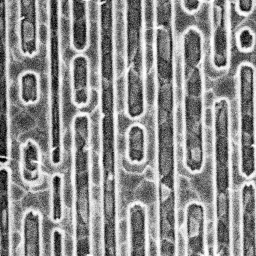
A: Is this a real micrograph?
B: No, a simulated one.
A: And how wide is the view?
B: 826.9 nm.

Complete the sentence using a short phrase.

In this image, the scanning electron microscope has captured parallel lines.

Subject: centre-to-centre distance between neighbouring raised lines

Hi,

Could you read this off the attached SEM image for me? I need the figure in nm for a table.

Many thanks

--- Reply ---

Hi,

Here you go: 88.8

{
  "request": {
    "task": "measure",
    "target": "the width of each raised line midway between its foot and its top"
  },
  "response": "43.7 nm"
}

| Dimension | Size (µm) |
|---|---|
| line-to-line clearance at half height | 0.0465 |